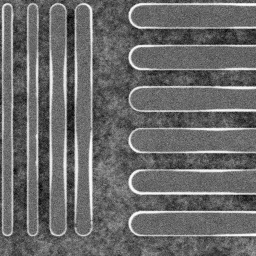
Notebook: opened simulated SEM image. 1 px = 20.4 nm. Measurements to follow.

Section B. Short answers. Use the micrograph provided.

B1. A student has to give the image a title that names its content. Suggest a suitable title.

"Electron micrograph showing groups of lines, slits or small figures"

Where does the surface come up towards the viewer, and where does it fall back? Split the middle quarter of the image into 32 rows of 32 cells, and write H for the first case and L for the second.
LLLHHHHLLLLLLLLLLHHHHHHHHHHHHHHH
LLLHHHHLLLLLLLLLLLLLLLLLLLLLLLLL
LLLHHHHLLLLLLLLLLLLLLLLLLLLLLLLL
LLLHHHHLLLLLLLLLLLLLLLLLLLLLLLLL
LLLHHHHLLLLLLLLLLLLLLLLLLLLLLLLL
LLLHHHHLLLLLLLLLLLLLLLLLLLLLLLLL
LLLHHHHLLLLLLLLLLHHHHHHHHHHHHHHH
LLLHHHHLLLLLLLLLLHHHHHHHHHHHHHHH
LLLHHHHLLLLLLLLLHHHHHHHHHHHHHHHH
LLLHHHHLLLLLLLLLHHHHHHHHHHHHHHHH
LLLHHHHLLLLLLLLLLHHHHHHHHHHHHHHH
LLLHHHHLLLLLLLLLLLHHHHHHHHHHHHHH
LLLHHHHLLLLLLLLLLLLLLLLLLLLLLLLL
LLLHHHHLLLLLLLLLLLLLLLLLLLLLLLLL
LLLHHHHLLLLLLLLLLLLLLLLLLLLLLLLL
LLLHHHHLLLLLLLLLLLLLLLLLLLLLLLLL
LLLHHHHLLLLLLLLLLLHHHHHHHHHHHHHH
LLLHHHHLLLLLLLLLLHHHHHHHHHHHHHHH
LLLHHHHLLLLLLLLLLHHHHHHHHHHHHHHH
LLLHHHHLLLLLLLLLLHHHHHHHHHHHHHHH
LLLHHHHLLLLLLLLLLHHHHHHHHHHHHHHH
LLLHHHHLLLLLLLLLLLHHHHHHHHHHHHHH
LLLHHHHLLLLLLLLLLLLLLLLLLLLLLLLL
LLLHHHHLLLLLLLLLLLLLLLLLLLLLLLLL
LLLHHHHLLLLLLLLLLLLLLLLLLLLLLLLL
LLLHHHHLLLLLLLLLLLLLLLLLLLLLLLLL
LLLHHHHLLLLLLLLLLLLLLHHHHHHLLLLL
LLLHHHHLLLLLLLLLLHHHHHHHHHHHHHHH
LLLHHHHLLLLLLLLLLHHHHHHHHHHHHHHH
LLLHHHHLLLLLLLLLLHHHHHHHHHHHHHHH
LLLHHHHLLLLLLLLLLHHHHHHHHHHHHHHH
LLLHHHHLLLLLLLLLLHHHHHHHHHHHHHHH